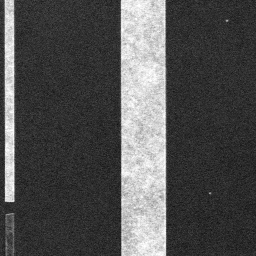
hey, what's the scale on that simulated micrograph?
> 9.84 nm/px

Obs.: wiring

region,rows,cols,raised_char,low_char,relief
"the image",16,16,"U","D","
UDDDDDDDUUDDDDDD
UDDDDDDDUUDDDDDD
UDDDDDDDUUDDDDDD
UDDDDDDDUUDDDDDD
UDDDDDDDUUDDDDDD
UDDDDDDDUUDDDDDD
UDDDDDDDUUDDDDDD
UDDDDDDDUUDDDDDD
UDDDDDDDUUDDDDDD
UDDDDDDDUUDDDDDD
UDDDDDDDUUDDDDDD
UDDDDDDDUUDDDDDD
DDDDDDDDUUDDDDDD
DDDDDDDDUUDDDDDD
DDDDDDDDUUDDDDDD
DDDDDDDDUUDDDDDD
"